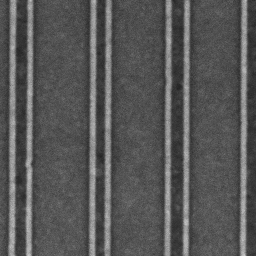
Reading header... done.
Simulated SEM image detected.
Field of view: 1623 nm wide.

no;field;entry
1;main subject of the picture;one or a few lines or trenches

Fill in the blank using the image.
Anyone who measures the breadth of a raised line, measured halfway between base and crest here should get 110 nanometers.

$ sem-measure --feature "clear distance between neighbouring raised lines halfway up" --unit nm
376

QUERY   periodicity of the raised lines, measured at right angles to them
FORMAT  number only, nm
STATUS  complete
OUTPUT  495